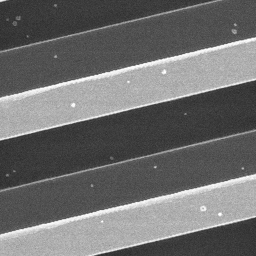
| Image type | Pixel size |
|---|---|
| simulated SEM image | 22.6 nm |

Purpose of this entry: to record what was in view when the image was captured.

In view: lines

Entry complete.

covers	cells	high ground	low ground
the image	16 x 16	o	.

............oooo
.......ooooooooo
...ooooooooooooo
oooooooooooooooo
oooooooooooooooo
oooooooooooooo..
oooooooooo......
ooooo...........
o..............o
..........oooooo
......oooooooooo
..oooooooooooooo
oooooooooooooooo
oooooooooooooooo
oooooooooooo....
oooooooo........